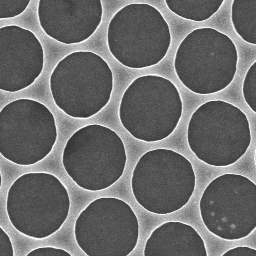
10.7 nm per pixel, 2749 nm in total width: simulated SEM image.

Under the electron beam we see a regular array of holes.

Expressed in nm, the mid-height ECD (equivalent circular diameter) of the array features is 692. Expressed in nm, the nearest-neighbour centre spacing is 777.